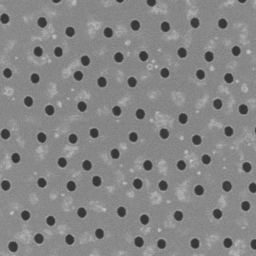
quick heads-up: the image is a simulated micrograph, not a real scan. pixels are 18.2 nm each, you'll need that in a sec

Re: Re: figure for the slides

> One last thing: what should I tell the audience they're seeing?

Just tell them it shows a regular array of holes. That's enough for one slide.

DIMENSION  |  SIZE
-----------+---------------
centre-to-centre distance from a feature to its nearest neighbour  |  460 nm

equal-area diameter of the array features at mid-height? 0.18 um